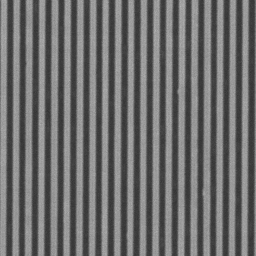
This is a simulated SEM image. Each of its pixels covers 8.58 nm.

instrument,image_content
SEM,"parallel lines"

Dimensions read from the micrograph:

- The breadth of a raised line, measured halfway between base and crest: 47.2 nm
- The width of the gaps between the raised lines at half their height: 55.8 nm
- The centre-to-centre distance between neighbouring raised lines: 109 nm